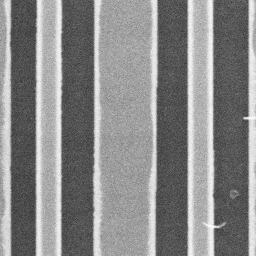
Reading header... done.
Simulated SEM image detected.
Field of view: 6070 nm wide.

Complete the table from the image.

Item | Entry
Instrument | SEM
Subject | lines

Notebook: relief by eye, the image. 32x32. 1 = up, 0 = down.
10000110000011111110000011000001
10000111000011111110000011000001
10000111000011111110000011000001
10000110000011111110000011000001
10000110000011111110000011000001
10000110000011111110000011000001
10000110000011111110000011000001
10000110000011111110000011000001
10000110000011111110000011000000
10000110000011111110000011000000
10000110000011111110000011000000
10000110000011111110000011000000
10000110000011111110000011000000
10000110000011111110000011000001
10000110000011111110000011000001
10000110000011111110000011000001
10000110000011111110000011000000
10000110000011111110000011000000
10000110000011111110000011000000
10000110000011111110000011100000
10000110000011111110000011100001
10000110000011111110000011100001
10000110000011111110000011000001
10000110000011111110000011000000
10000110000011111110000011000001
10000110000011111110000011100001
10000110000011111110000011100001
10000110000011111110000011100001
10000110000011111110000011100000
10000110000011111110000011100000
10000110000011111110000011100001
10000110000011111110000011100001